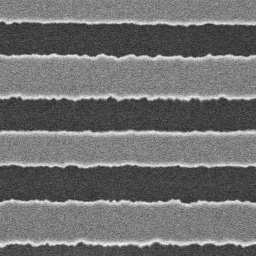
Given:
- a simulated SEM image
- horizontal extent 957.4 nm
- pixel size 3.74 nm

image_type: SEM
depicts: lines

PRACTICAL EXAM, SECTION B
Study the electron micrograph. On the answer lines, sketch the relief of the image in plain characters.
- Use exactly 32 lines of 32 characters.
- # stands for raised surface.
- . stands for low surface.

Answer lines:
################################
################################
################################
................................
................................
................................
................................
################################
################################
################################
################################
################################
.........#......................
................................
................................
................................
#########.#..########...###..###
################################
################################
################################
################################
................................
................................
................................
................................
################################
################################
################################
################################
################################
#...#.#.#...####.##...##.#.#.###
................................